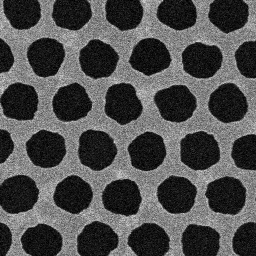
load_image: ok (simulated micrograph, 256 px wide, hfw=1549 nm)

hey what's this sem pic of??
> a regular array of holes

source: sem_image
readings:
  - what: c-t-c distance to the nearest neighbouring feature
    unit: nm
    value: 305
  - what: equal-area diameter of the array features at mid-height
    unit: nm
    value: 233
